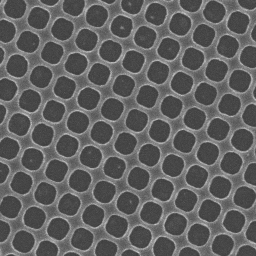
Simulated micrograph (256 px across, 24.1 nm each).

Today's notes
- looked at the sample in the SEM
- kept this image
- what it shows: a regular array of holes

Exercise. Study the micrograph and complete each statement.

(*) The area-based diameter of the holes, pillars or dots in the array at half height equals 538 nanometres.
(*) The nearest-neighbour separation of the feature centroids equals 622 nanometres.